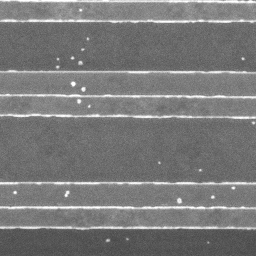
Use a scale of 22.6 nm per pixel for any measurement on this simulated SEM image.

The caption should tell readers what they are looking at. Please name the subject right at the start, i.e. lines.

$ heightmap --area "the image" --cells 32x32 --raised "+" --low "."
++++++++++++++++++++++++++++++++
++++++++++++++++++++++++++++++++
++++++++++++++++++++++++++++++++
................................
................................
................................
................................
................................
................................
++++++++++++++++++++++++++++++++
++++++++++++++++++++++++++++++++
++++++++++++++++++++++++++++++++
++++++++++++++++++++++++++++++++
++++++++++++++++++++++++++++++++
..++....++++++++++++++++++++++++
................................
................................
................................
................................
................................
................................
................................
................................
++++++++++++++++++++++++++++++++
++++++++++++++++++++++++++++++++
++++++++++++++++++++++++++++++++
++++++++++++++++++++++++++++++++
++++++++++++++++++++++++++++++++
+.+++..+++++++++++++++++++++++++
................................
................................
................................